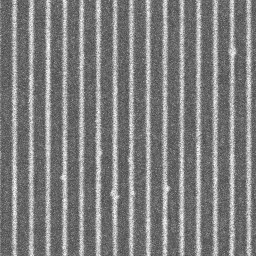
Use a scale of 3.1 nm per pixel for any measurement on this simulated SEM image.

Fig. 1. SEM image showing parallel lines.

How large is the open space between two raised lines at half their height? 36.8 nanometers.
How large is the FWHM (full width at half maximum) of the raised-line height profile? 15.1 nanometers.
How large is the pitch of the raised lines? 52.1 nm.